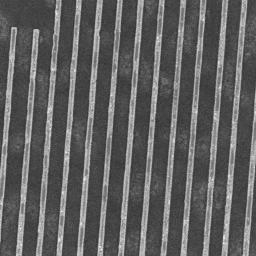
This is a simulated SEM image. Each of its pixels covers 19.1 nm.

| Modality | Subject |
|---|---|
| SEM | parallel lines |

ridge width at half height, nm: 85.8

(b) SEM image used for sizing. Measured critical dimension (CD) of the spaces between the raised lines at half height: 312 nanometers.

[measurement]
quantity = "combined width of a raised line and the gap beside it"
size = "394 nm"